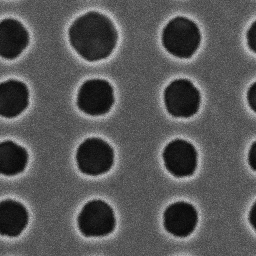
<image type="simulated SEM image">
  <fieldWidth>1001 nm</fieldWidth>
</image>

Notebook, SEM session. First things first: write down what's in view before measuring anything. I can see holes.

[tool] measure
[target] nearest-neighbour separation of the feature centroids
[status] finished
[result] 232 nanometers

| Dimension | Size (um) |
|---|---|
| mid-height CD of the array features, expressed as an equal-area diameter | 0.15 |